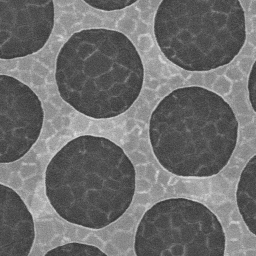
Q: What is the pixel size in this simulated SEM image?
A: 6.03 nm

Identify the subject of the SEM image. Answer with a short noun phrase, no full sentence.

holes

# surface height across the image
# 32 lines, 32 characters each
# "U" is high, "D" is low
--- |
DDDDDDDUUUUDDDDDUUUUDDDDDDDDDDUU
DDDDDDDUUUUUUUUUUUUDDDDDDDDDDDDU
DDDDDDDUUUUUUUUUUUUDDDDDDDDDDDDU
DDDDDDDUUUUUUUUUUUUDDDDDDDDDDDDU
DDDDDDUUUDDDDDDDUUUDDDDDDDDDDDDU
DDDDDDUUDDDDDDDDDUUUDDDDDDDDDDDU
DDDDDUUDDDDDDDDDDUUUDDDDDDDDDDUU
UUUUUUUDDDDDDDDDDDUUUDDDDDDDDUUU
UUUUUUUDDDDDDDDDDDUUUUUDDDDUUUUD
DUUUUUUDDDDDDDDDDDUUUUUUUUUUUUUD
DDDUUUUDDDDDDDDDDDUUUUUUUUUUUUUD
DDDDUUUDDDDDDDDDDDUUUDDDDDDUUUUD
DDDDDUUUDDDDDDDDDUUUDDDDDDDDUUUD
DDDDDUUUUDDDDDDDUUUDDDDDDDDDDUUU
DDDDDUUUUUUDDDDUUUUDDDDDDDDDDUUU
DDDDDUUUUUUUUUUUUUUDDDDDDDDDDDUU
DDDDDUUUUUUUUUUUUUUDDDDDDDDDDDUU
DDDDDUUUUDDDDDUUUUUDDDDDDDDDDDUU
DDDDUUUUDDDDDDDUUUUDDDDDDDDDDUUU
DDDUUUUDDDDDDDDDUUUDDDDDDDDDDUUU
UUUUUUDDDDDDDDDDDUUUDDDDDDDDUUUD
UUUUUUDDDDDDDDDDDUUUUDDDDDDUUUDD
UUUUUUDDDDDDDDDDDUUUUUUUUUUUUUDD
DUUUUUDDDDDDDDDDDUUUUUUUUUUUUUDD
DDUUUUDDDDDDDDDDDUUUUUUUUUUUUUDD
DDDUUUDDDDDDDDDDUUUDDDDDDUUUUUDD
DDDDUUUDDDDDDDDDUUDDDDDDDDUUUUDD
DDDDUUUUDDDDDDDUUUDDDDDDDDDUUUDD
DDDDUUUUUUUDDUUUUDDDDDDDDDDDUUUD
DDDDUUUUUUUUUUUUUDDDDDDDDDDDUUUU
DDDDUUUUDDDUUUUUUDDDDDDDDDDDUUUU
DDDDUUDDDDDDDUUUUDDDDDDDDDDDUUUU